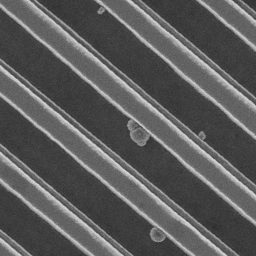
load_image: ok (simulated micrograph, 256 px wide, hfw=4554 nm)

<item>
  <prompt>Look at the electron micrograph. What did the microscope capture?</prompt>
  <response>lines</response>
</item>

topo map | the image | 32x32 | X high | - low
XXXXX--------XXXXX-------XXXXXX-
-XXXXX--------XXXXX--------XXXXX
--XXXXX--------XXXXX--------XXXX
---XXXXXX-------XXXXXX-------XXX
----XXXXXX-------XXXXXX-------XX
------XXXXX-------XXXXXX-------X
-------XXXXX--------XXXXX-------
--------XXXXX--------XXXXX------
X--------XXXXX--------XXXXX-----
XXX-------XXXXXX-------XXXXXX---
XXXX--------XXXXX-------XXXXXX--
XXXXX--------XXXXX-------XXXXXX-
-XXXXX--------XXXXX--------XXXXX
--XXXXX--------XXXXX--------XXXX
---XXXXXX-------XXXXXX-------XXX
----XXXXXX-------XXXXXX-------XX
------XXXXX--------XXXXX-------X
-------XXXXX--------XXXXX-------
X-------XXXXX--------XXXXX------
XX-------XXXXXX-------XXXXXX----
XXX-------XXXXXX-------XXXXXX---
XXXX--------XXXXX-------XXXXXX--
XXXXX--------XXXXX--------XXXXX-
-XXXXX--------XXXXXX-------XXXXX
--XXXXXX-------XXXXXX-------XXXX
----XXXXX-------XXXXXX-------XXX
-----XXXXX--------XXXXX-------XX
------XXXXX--------XXXXX-------X
-------XXXXX--------XXXXXX------
X-------XXXXXX-------XXXXXX-----
XX--------XXXXX-------XXXXXX----
XXX--------XXXXX-------XXXXXX---